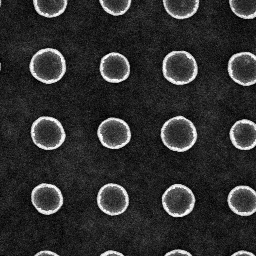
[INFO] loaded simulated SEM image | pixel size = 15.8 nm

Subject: a regular array of raised bodies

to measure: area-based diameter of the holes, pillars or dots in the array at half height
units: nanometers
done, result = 494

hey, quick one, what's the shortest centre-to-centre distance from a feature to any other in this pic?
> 1030 nm